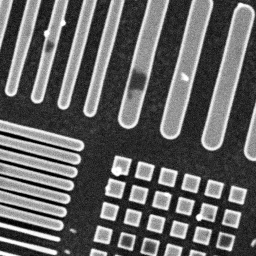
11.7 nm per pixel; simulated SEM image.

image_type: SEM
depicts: groups of lines, slits or small figures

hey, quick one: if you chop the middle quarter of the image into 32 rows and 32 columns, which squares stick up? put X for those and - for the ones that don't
-XXX----XXX------XXXXX------XXXX
XXXX----XXX------XXXXX------XXXX
XXX----XXX------XXXXXX------XXXX
XXX----XXX------XXXXX------XXXXX
XXX----XXX------XXXXX------XXXXX
XX----XXX-------XXXXX------XXXXX
XX----XXX------XXXXX-------XXXXX
XX----XXX------XXXXX------XXXXX-
XX----XXX------XXXXX------XXXXX-
X----XXXX------XXXXX------XXXXX-
X----XXX------XXXXX------XXXXXX-
-----XXX------XXXXX------XXXXX--
-----XXX------XXXXX------XXXXX--
--------------XXXX-------XXXXX--
--------------XXXX-------XXXXX--
--------------XXXX------XXXXX---
------------------------XXXXX---
-------------------------XXXX---
X-------------------------XX----
XXXX----------------------------
XXXXX---------------------------
---X----------------------------
XXX-----------------------------
XXXX---------XX-----------------
XXXX--------XXXXX---------------
X-----------XXXX---XXX----------
XXX---------XXXX--XXXX--XX------
XXX----------X-X--XXXX--XXXX----
-------------------XXX--XXXX--XX
XX---------XXX----------XXXX--XX
XX---------XXXX--X--------X---XX
-----------XXXX--XXXX----------X